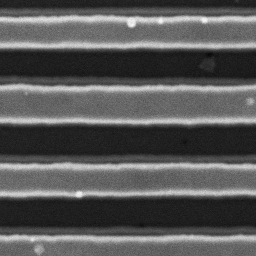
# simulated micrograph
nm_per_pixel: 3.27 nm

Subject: lines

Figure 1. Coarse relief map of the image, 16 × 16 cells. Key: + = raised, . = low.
................
++++++++++++++++
++++++++++++++++
................
................
++++++++++++++++
++++++++++++++++
++++++++++++++++
................
................
++++++++++++++++
++++++++++++++++
................
................
++++++++++++++++
++++++++++++++++